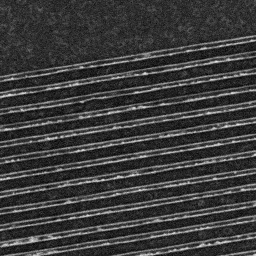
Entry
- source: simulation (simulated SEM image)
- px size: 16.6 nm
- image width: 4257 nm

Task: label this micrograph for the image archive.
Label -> parallel lines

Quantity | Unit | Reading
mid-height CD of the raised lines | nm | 88.2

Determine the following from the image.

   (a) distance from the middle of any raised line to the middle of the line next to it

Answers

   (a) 270 nanometres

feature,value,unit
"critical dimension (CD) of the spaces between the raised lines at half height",0.176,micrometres